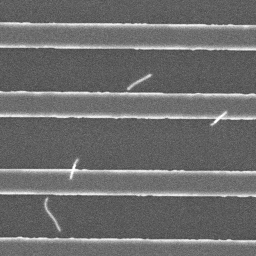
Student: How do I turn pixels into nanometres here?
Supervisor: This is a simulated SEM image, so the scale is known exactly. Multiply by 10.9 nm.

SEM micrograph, lines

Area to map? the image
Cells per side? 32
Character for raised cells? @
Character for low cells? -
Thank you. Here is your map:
--------------------------------
--------------------------------
--------------------------------
@@@@@@@@@@@@@@@@@@@@@@@@@@@@@@@@
@@@@@@@@@@@@@@@@@@@@@@@@@@@@@@@@
@@@@@@@@@@@@@@@@@@@@@@@@@@@@@@@@
--------------------------------
--------------------------------
--------------------------------
--------------------------------
--------------------------------
@-@@----------------------------
@@@@@@@@@@@@@@@@@@@@@@@@@@@@@@@@
@@@@@@@@@@@@@@@@@@@@@@@@@@@@@@@@
@@@@@@@@@@@@@@@@@@@@@@@@@@@@@@@@
--------------------------------
--------------------------------
--------------------------------
--------------------------------
--------------------------------
--------------------------------
@@@@@@@@@@@@@@@@@@@@@@@@@@@@@-@@
@@@@@@@@@@@@@@@@@@@@@@@@@@@@@@@@
@@@@@@@@@@@@@@@@@@@@@@@@@@@@@@@@
-----------------------------@@@
--------------------------------
--------------------------------
--------------------------------
--------------------------------
--------------------------------
@@@@@@@@@@@@@@@@@@@@@@@@@@@@@@@@
@@@@@@@@@@@@@@@@@@@@@@@@@@@@@@@@